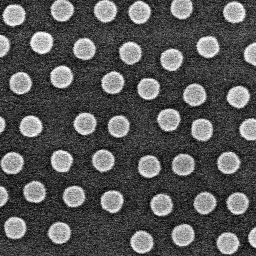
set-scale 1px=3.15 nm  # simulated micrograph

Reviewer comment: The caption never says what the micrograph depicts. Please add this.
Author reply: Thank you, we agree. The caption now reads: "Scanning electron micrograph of a regular array of raised bodies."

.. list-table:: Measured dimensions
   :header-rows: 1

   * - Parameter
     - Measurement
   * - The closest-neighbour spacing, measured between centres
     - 117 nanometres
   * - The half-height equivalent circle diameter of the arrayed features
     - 0.0669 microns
